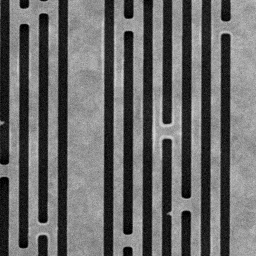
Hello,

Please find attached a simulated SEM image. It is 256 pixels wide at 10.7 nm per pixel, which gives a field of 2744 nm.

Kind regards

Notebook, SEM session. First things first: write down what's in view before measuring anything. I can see groups of lines, slits or small figures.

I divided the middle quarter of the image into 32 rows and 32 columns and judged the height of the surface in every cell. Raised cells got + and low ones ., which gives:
.+++++++++...++..+++..+++..++...
.+++++++++...++..+++..+++..++...
.+++++++++...++..+++..+++..++...
.+++++++++...++..+++..+++..++...
.+++++++++...++..+++..+++..++...
.+++++++++...++..+++..+++..++...
.+++++++++...++..+++..+++..++...
.+++++++++...++..+++..++...++...
.+++++++++...++..++...++...++...
.+++++++++...++..++...++...++...
.+++++++++...++..++...++...++...
.+++++++++...++..++...++...++...
.+++++++++...++..++....+...++...
.+++++++++...++..++....+...++...
.+++++++++...++..++...++...++...
.+++++++++...++..++...+++++++...
.+++++++++...++..+++..+++++++...
.+++++++++...++..+++..+++++++...
.+++++++++...++..+++..+++..++...
.+++++++++...++..+++..++...++...
.+++++++++...++..+++..++...++...
.+++++++++...++..++...++...++...
.+++++++++...++..++...++...++...
.+++++++++...++..++...++...++...
.+++++++++...++..++...++...++...
.+++++++++...++..++...++...++...
.+++++++++...++..++...++...++...
.+++++++++...++..++...++...++...
.+++++++++...++..++...++...++...
.+++++++++...++..++...++...++...
.+++++++++...++..++...++...++...
.+++++++++...++..++...++...++...